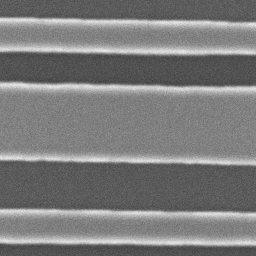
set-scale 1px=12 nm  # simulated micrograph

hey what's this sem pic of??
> lines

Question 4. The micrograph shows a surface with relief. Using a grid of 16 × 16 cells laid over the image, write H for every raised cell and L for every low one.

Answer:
LLLLLLLLLLLLLLLL
HHHHHHHHHHHHHHHH
HHHHHHHHHHHHHHHH
LLLLLLLLLLLLLLLL
LLLLLLLLLLLLLLLL
HHHHHHHHHHHLLLLL
HHHHHHHHHHHHHHHH
HHHHHHHHHHHHHHHH
HHHHHHHHHHHHHHHH
HHHHHHHHHHHHHHHH
LLLLLLLLLLLLLLLL
LLLLLLLLLLLLLLLL
LLLLLLLLLLLLLLLL
HHHHHHHHHHHHHHHH
HHHHHHHHHHHHHHHH
LLLLLLLLLLLLLLLL